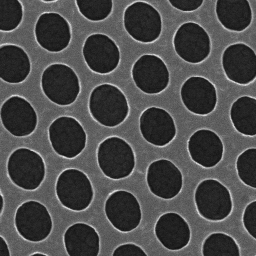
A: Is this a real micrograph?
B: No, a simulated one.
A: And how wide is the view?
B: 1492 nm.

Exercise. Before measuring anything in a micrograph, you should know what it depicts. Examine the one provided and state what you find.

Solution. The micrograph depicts a regular array of holes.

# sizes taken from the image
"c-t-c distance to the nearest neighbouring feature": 302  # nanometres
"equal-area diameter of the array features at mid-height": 223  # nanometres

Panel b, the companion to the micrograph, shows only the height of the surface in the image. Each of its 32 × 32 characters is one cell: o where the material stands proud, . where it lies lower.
...ooooooo....ooo.ooo....oo....o
...ooooooo....oo....ooooooo....o
...oo...ooo..oo.....ooooooo....o
..oo.....ooooooo....oo...ooo...o
oooo.....oo..ooo....oo....oooooo
ooooo....oo...oooooooo....oooooo
...ooooooo.....ooooooo....oo....
....ooooooo....oo...ooo..ooo....
....oo...oo...ooo....ooooooo....
...oo.....ooooooo....ooooooo....
ooooo.....ooooooo....oo...oooo.o
oooooo....oo...ooo..ooo....ooooo
o..ooo...oo.....ooooooo....ooo..
....ooooooo.....ooo.ooo....oo...
.....ooooooo....oo...oooooooo...
.....o....ooo..ooo....ooooooo...
o...oo.....ooooooo....ooo..ooo..
oooooo.....oo..ooo...ooo....oooo
ooooooo...oo....oooooooo....oooo
o....ooo.ooo.....ooooooo....oo..
o....ooooooo.....oo...ooo..ooo..
o.....oo..ooo...oo.....ooooooo..
o....oo....ooooooo.....ooo.ooo..
ooo..oo....oooooooo....oo...oooo
ooooooo.....oo...ooo..oo.....ooo
ooo..ooo...oo....oooooooo....oo.
oo....ooooooo.....ooooooo....oo.
oo....oooooooo....oo...ooo..oo..
oo....ooo...ooo..oo.....ooooooo.
ooo...oo....oooooooo....oo...ooo
.ooooooo....oooooooo...oo.....oo
.ooooooo....oo....ooooooo.....oo